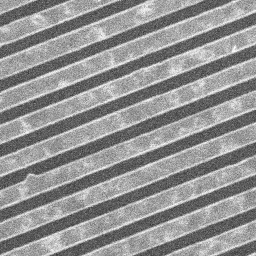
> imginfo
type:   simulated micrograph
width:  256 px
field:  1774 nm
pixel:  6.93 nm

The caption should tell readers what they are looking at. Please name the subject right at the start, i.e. parallel lines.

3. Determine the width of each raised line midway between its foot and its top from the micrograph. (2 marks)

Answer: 117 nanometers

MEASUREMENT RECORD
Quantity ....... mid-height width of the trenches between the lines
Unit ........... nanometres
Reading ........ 94.4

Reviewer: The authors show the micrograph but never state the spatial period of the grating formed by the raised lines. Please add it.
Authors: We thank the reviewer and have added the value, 210 nanometres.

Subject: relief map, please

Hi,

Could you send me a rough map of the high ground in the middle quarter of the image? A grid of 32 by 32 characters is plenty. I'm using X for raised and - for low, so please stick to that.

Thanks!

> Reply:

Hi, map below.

-XXXXXXXXXXXX---------XXXXXXXXXX
XXXXXXXXXX---------XXXXXXXXXXX--
XXXXXXXX---------XXXXXXXXXXX----
XXXXX---------XXXXXXXXXXXX------
XX----------XXXXXXXXXXX---------
---------XXXXXXXXXXXX---------XX
-------XXXXXXXXXXX----------XXXX
-----XXXXXXXXXXX---------XXXXXXX
--XXXXXXXXXXX----------XXXXXXXXX
XXXXXXXXXXX---------XXXXXXXXXXXX
XXXXXXX----------XXXXXXXXXXXX---
XXXXX----------XXXXXXXXXXX------
XX----------XXXXXXXXXXXX--------
----------XXXXXXXXXXX----------X
-------XXXXXXXXXXXX---------XXXX
-----XXXXXXXXXXX----------XXXXXX
--XXXXXXXXXXXX---------XXXXXXXXX
XXXXXXXXXXX---------XXXXXXXXXXX-
XXXXXXXXX---------XXXXXXXXXXX---
XXXXXX----------XXXXXXXXXX------
XXX----------XXXXXXXXXXX--------
X---------XXXXXXXXXXX----------X
--------XXXXXXXXXXX---------XXXX
-----XXXXXXXXXXX----------XXXXXX
---XXXXXXXXXXX---------XXXXXXXXX
XXXXXXXXXXX----------XXXXXXXXXXX
XXXXXXXX----------XXXXXXXXXXX---
XXXXXX----------XXXXXXXXXXX-----
XXX----------XXXXXXXXXXX--------
X----------XXXXXXXXXXX----------
--------XXXXXXXXXXX----------XXX
------XXXXXXXXXXX---------XXXXXX